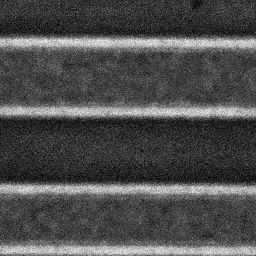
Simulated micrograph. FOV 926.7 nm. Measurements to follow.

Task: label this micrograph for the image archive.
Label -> one or a few lines or trenches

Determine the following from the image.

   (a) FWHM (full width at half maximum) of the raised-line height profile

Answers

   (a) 236 nanometers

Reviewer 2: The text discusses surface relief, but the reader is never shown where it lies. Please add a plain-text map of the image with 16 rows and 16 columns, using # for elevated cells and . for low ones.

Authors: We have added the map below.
................
................
................
################
################
################
################
................
................
................
................
................
################
################
################
################